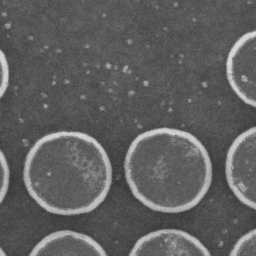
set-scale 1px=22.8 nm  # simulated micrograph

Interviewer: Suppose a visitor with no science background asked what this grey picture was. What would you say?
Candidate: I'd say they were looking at raised bodies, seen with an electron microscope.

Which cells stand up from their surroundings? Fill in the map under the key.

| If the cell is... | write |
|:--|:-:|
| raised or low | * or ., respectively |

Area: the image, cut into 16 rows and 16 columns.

................
................
...............*
..............**
..............**
...............*
................
................
...**....***...*
..****..*****.**
..*****.*****.**
..*****.*****..*
..****...***...*
................
..........*.....
..****...****..*